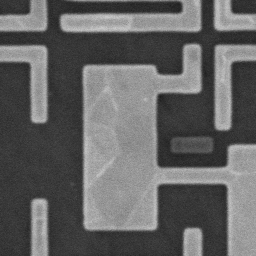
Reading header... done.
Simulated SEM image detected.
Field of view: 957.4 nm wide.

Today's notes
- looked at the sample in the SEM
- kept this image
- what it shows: wiring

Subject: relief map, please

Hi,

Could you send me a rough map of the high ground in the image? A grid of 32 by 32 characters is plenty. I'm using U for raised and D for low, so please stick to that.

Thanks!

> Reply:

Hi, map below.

DDDDUUDDDDDDDDDDDDDDDDDUUDDUUDDD
DDDDUUDDDDDDDDDDDDDDDDDUUDDUUDDD
UUUUUUDDUUUUUUUUUUUUUUUUUDDUUUUU
UUUUUUDDUUUUUUUUUUUUUUUUUDDUUUUU
DDDDDDDDDDDDDDDDDDDDDDDDDDDDDDDD
DDDDDDDDDDDDDDDDDDDDDDDDDDDDDDDD
UUUUUUDDDDDDDDDDDDDDDDDUUDDUUUUU
UUUUUUDDDDDDDDDDDDDDDDDUUDDUUUUU
DDDDUUDDDDDUUUUUUUUDDDDUUDDUUDDD
DDDDUUDDDDDUUUUUUUUUUDUUUDDUUDDD
DDDDUUDDDDDUUUUUUUUUUUUUUDDUUDDD
DDDDUUDDDDDUUUUUUUUUDDDDDDDUUDDD
DDDDUUDDDDDUUUUUUUUDDDDDDDDUUDDD
DDDDUUDDDDDUUUUUUUUDDDDDDDDUUDDD
DDDDUUDDDDDUUUUUUUUDDDDDDDDUUDDD
DDDDDDDDDDDUUUUUUUUDDDDDDDDUUDDD
DDDDDDDDDDDUUUUUUUUDDDDDDDDDDDDD
DDDDDDDDDDDUUUUUUUUDDDUUUUDDDDDD
DDDDDDDDDDDUUUUUUUUDDUUUUUUDDUUU
DDDDDDDDDDDUUUUUUUUDDDDDDDDDDUUU
DDDDDDDDDDDUUUUUUUUUDDDDDDDDUUUU
DDDDDDDDDDDUUUUUUUUUUUUUUUUUUUUU
DDDDDDDDDDDUUUUUUUUUUUUUUUUUUUUU
DDDDDDDDDDDUUUUUUUUUDDDDDDDDUUUU
DDDDDDDDDDDUUUUUUUUUDDDDDDDDDUUU
DDDDUUDDDDDUUUUUUUUUDDDDDDDDDUUU
DDDDUUDDDDDUUUUUUUUUDDDDDDDDDUUU
DDDDUUDDDDDUUUUUUUUUDDDDDDDDDUUU
DDDDUUDDDDDUUUUUUUUDDDDDDDDDDUUU
DDDDUUDDDDDDDDDDDDDDDDDUUDDDDUUU
DDDDUUDDDDDDDDDDDDDDDDDUUDDDDUUU
DDDDUUDDDDDDDDDDDDDDDDDUUDDDDUUU